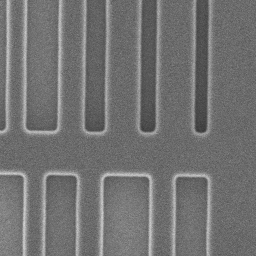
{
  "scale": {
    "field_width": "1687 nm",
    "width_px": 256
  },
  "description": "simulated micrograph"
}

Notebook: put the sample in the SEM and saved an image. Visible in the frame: groups of lines, slits or small figures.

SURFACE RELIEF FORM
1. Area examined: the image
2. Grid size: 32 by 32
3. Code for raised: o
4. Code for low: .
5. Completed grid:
.oo....oooo..ooooo..oooo..oooooo
.oo....oooo..ooooo..oooo..oooooo
.oo....oooo..ooooo..oooo..oooooo
.oo....oooo..ooooo..oooo..oooooo
.oo....oooo..oooo...oooo..oooooo
.oo....oooo..oooo...oooo..oooooo
.oo....oooo..oooo...oooo..oooooo
.oo....oooo..oooo...oooo..oooooo
.oo....oooo..oooo...oooo..oooooo
.oo....oooo..oooo...oooo..oooooo
.oo....oooo..oooo...oooo..oooooo
.oo....oooo..oooo...oooo..oooooo
.oo....oooo..oooo...oooo..oooooo
.oo....ooo...oooo...oooo..oooooo
.oo....ooo...oooo...oooo..oooooo
.oo....ooo...oooo...oooo..oooooo
ooooooooooo.oooooo.oooooo.oooooo
oooooooooooooooooooooooooooooooo
oooooooooooooooooooooooooooooooo
oooooooooooooooooooooooooooooooo
oooooooooooooooooooooooooooooooo
oooooooooooooooooooooooooooooooo
...ooo....ooo......ooo....oooooo
...ooo....ooo......ooo....oooooo
...ooo....ooo......ooo....oooooo
...ooo....ooo......ooo....oooooo
...ooo....ooo......ooo....oooooo
...ooo....ooo......ooo....oooooo
...ooo....ooo......ooo....oooooo
...ooo....ooo......ooo....oooooo
...ooo....ooo......ooo....oooooo
...ooo....ooo......ooo....oooooo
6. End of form